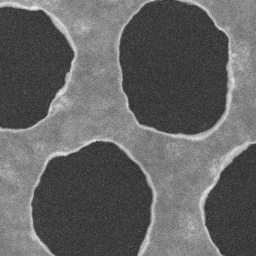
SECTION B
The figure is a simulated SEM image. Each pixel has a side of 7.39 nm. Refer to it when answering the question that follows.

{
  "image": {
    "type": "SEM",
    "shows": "holes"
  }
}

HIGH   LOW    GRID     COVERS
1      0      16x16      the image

0111111110000111
0000111100000111
0000111100000011
0000011000000011
0000111100000011
0000111100000011
0001111100000011
0001111110000011
1111111111111111
1111100011111110
1110000001111100
1100000001111000
1100000000111000
1100000001111000
1100000001111000
1110000001111100